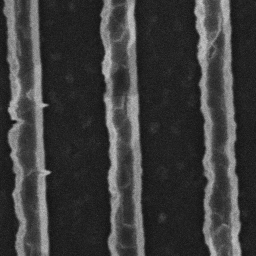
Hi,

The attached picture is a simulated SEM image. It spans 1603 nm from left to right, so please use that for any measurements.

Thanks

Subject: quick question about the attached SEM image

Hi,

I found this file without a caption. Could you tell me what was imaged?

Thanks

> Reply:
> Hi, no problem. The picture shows one or a few lines or trenches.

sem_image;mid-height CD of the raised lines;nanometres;157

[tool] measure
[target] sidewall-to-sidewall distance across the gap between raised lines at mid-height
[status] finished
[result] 69.8 pixels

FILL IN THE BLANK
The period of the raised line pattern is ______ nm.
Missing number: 597